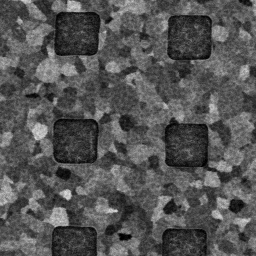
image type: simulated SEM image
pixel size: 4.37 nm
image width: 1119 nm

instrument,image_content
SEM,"holes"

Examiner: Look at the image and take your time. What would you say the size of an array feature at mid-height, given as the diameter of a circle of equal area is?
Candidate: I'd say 216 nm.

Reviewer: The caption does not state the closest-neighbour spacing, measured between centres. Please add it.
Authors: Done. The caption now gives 469 nm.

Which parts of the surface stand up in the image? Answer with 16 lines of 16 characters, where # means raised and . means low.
################
###...#####..###
###...####...###
###########..###
################
################
################
####..##########
###...####...###
###...####...###
################
################
################
################
###...####...###
###...####...###